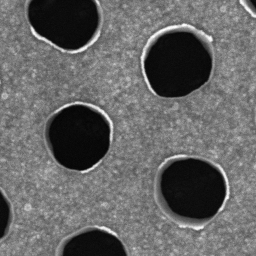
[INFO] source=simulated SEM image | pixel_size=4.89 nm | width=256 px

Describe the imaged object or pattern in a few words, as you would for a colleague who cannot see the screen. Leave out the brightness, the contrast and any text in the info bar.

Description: holes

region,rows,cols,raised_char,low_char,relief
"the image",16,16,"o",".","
oo....oooooooooo
oo....oooooooooo
ooo...oooo...ooo
ooooooooo....ooo
ooooooooo....ooo
oooooooooo..oooo
oooooooooooooooo
ooo....ooooooooo
ooo....ooooooooo
ooo....ooooooooo
oooo..oooo...ooo
oooooooooo....oo
oooooooooo....oo
.oooooooooo..ooo
ooooo..ooooooooo
oooo....oooooooo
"